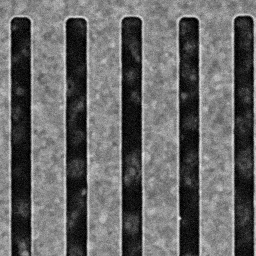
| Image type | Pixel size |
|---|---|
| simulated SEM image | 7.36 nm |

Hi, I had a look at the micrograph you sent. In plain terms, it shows parallel lines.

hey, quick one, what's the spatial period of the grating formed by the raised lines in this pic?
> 0.413 µm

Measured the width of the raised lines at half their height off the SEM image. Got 250 nm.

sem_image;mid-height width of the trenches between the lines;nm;156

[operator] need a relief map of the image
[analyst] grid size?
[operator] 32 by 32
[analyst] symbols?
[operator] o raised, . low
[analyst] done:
oooooooooooooooooooooooooooooooo
oooooooooooooooooooooooooooooooo
o...oooo...oooo...oooo...oooo...
o...oooo...oooo...oooo...oooo...
o...oooo...oooo...oooo...oooo...
o...oooo...oooo...oooo...oooo...
o...oooo...oooo...oooo...oooo...
o...oooo...oooo...oooo...oooo...
o...oooo...oooo...oooo...oooo...
o...oooo...oooo...oooo...oooo...
o...oooo...oooo...oooo...oooo...
o...oooo...oooo...oooo...oooo...
o...oooo...oooo...oooo...oooo...
o...oooo...oooo...oooo...oooo...
o...oooo...oooo...oooo...oooo...
o...oooo...oooo...oooo...oooo...
o...oooo...oooo...oooo...oooo...
o...oooo...oooo...oooo...oooo...
o...oooo...oooo...oooo...oooo...
o...oooo...oooo...oooo...oooo...
o...oooo...oooo...oooo...oooo...
o...oooo...oooo...oooo...oooo...
o...oooo...oooo...oooo...oooo...
o...oooo...oooo...oooo...oooo...
o...oooo...oooo...oooo...oooo...
o...oooo...oooo...oooo...oooo...
o...oooo...oooo...oooo...oooo...
o...oooo...oooo...oooo...oooo...
o...oooo...oooo...oooo...oooo...
o...oooo...oooo...oooo...oooo...
o...oooo...oooo...oooo...oooo...
o...oooo...oooo...oooo...oooo...